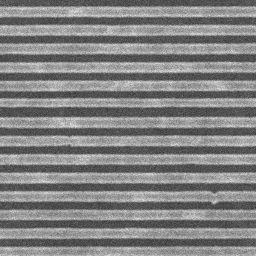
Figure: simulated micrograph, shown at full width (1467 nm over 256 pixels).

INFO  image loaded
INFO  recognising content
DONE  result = parallel lines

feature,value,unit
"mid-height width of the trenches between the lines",55.1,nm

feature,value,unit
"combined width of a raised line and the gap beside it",106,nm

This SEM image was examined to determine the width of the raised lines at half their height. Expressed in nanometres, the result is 50.1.